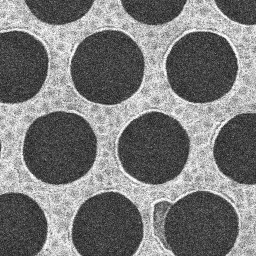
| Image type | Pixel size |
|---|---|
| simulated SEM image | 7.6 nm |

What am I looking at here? holes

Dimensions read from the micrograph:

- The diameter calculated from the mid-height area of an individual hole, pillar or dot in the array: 560 nanometres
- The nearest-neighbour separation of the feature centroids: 710 nm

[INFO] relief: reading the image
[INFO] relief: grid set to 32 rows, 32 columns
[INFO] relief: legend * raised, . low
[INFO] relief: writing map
***.........***........****.....
****.......*****.......*****....
*****.....*******.....*******...
********************************
....*******.....*******.....****
.....*****.......*****.......***
......***.........***........***
......***.........***.........**
......***.........***.........**
......***.........***.........**
.....****.........***........***
.....*****.......*****.......***
....*******.....*******....*****
********************************
*****.....*******....********...
****.......*****.......*****....
***.........***........****.....
***.........***.........***.....
***.........***.........***.....
***.........***.........***.....
***.........***........****.....
****.......*****.......*****....
*****.....*******....********...
********************************
....********....*******....*****
.....*****.......***.........***
.....*****.......**..........***
......***.........*...........**
......***.........*...........**
......***.........**..........**
......***.........**.........***
.....*****.......****........***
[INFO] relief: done